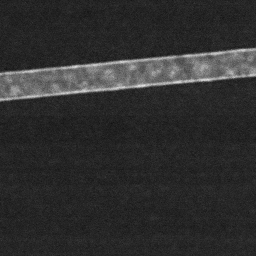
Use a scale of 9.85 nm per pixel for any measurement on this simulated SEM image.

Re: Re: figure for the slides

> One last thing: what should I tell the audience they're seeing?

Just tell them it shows one or a few lines or trenches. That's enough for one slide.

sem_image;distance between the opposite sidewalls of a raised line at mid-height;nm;257